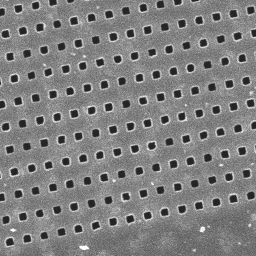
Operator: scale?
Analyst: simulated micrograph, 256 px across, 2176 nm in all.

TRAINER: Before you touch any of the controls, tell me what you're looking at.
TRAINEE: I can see a regular array of holes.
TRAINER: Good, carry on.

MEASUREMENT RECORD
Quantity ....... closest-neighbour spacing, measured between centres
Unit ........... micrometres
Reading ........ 0.147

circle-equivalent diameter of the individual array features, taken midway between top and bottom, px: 8.28